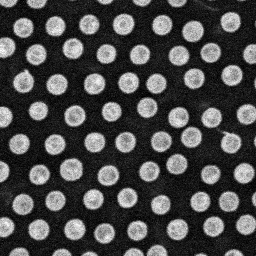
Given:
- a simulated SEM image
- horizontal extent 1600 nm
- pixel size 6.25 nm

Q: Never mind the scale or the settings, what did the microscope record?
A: a regular array of raised bodies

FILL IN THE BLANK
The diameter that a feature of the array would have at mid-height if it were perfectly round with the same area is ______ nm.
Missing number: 114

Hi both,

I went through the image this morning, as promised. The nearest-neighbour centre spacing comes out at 0.186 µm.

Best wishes